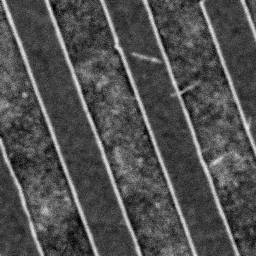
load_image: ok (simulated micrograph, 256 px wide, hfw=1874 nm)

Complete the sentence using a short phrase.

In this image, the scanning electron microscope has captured one or a few lines or trenches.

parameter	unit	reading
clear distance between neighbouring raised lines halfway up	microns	0.379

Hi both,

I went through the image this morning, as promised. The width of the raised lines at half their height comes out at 296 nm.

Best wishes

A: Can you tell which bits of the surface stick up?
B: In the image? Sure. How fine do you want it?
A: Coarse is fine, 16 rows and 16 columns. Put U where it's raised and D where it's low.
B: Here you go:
UUUDDDDUUDDDDUUD
DUUDDDDUUUDDDUUU
DUUUDDDUUUDDDUUU
DDUUDDDDUUDDDDUU
DDUUUDDDUUUDDDUU
DDUUUDDDUUUDDDDU
DDDUUDDDDUUDDDDU
DDDUUUDDDUUUDDDU
DDDUUUDDDUUUDDDD
DDDDUUDDDDUUDDDD
UDDDUUUDDDUUUDDD
UDDDUUUDDDDUUDDD
UDDDDUUUDDDUUUDD
UUDDDUUUDDDUUUDD
UUDDDDUUDDDDUUDD
UUDDDDUUUDDDUUUD